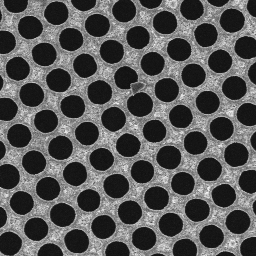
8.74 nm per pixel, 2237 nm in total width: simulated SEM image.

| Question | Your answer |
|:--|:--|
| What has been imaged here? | a regular array of holes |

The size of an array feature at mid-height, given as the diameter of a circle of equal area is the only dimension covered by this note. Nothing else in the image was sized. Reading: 209 nm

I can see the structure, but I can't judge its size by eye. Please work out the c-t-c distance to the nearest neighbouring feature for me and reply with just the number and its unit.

261 nanometers